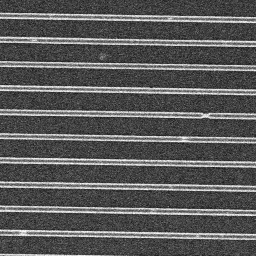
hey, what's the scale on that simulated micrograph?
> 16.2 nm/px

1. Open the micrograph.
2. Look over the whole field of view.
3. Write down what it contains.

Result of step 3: parallel lines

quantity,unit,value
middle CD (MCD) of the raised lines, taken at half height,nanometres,89.2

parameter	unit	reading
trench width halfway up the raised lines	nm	310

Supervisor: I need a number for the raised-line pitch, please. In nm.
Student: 391